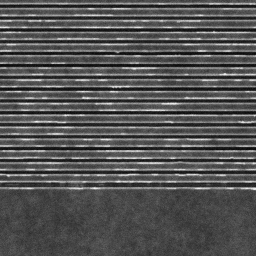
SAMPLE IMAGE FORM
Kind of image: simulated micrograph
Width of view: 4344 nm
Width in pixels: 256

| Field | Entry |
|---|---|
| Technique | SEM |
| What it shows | parallel lines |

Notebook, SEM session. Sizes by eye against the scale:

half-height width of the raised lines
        129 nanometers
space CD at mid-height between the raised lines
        3.75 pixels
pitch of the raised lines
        11.9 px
